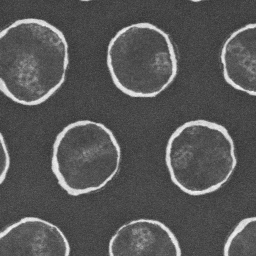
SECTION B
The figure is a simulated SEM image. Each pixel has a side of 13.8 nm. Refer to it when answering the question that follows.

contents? raised bodies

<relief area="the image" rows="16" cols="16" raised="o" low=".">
................
.oo.............
oooo...ooo....oo
oooo...oooo...oo
oooo...oooo...oo
ooo.....oo.....o
................
................
....ooo....ooo..
...oooo....oooo.
...oooo....oooo.
....oo.....ooo..
................
................
oooo...oooo....o
oooo...oooo...oo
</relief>